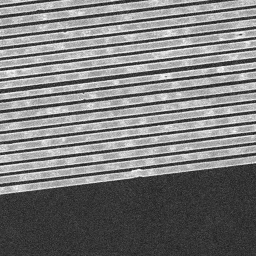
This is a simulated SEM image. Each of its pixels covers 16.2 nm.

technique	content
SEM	parallel lines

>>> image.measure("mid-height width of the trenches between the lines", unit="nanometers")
58.2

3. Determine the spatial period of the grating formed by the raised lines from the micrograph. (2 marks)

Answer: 10.5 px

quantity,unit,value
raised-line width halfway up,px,6.57